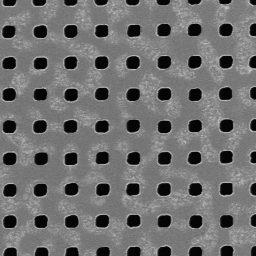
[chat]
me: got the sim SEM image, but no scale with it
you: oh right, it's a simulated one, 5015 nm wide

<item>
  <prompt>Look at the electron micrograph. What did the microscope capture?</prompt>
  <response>a regular array of holes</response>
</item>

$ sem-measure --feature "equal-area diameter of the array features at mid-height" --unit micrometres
0.272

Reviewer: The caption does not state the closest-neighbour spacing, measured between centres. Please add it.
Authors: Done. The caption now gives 601 nanometers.